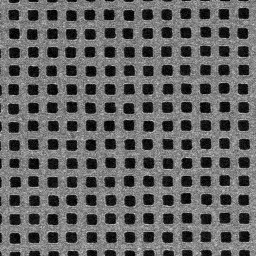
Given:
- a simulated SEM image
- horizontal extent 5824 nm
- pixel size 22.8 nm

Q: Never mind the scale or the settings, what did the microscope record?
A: a regular array of holes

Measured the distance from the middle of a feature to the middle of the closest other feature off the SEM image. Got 414 nanometers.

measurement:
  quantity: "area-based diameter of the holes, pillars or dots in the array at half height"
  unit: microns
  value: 0.288